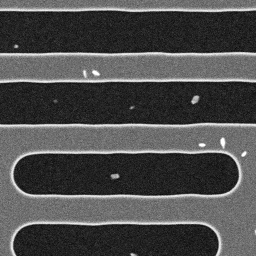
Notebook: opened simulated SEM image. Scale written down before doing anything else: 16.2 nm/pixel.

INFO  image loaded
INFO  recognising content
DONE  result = groups of lines, slits or small figures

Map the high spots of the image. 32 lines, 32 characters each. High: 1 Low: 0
11111111111111111111111111111111
00000000000000000000000000000000
00000000000000000000000000000000
00000000000000000000000000000000
00000000000000000000000000000000
00000000000000000000000000000000
00000000000000000000000000000000
11111111111111111111111111111111
11111111111111111111111111111111
11111111111111111111111111111111
00000000000000000000000000000000
00000000000000000000000000000000
00000000000000000000000000000000
00000000000000000000000000000000
00000000000000000000000000000000
00000000000000000000000001100000
11111111111111111111111111111111
11111111111111111111111111111111
11111111111111111111111111111111
11100000000000000000000000000111
11000000000000000000000000000011
11000000000000000000000000000011
11000000000000000000000000000011
11000000000000000000000000000111
11111111111111111100111111111111
11111111111111111111111111111111
11111111111111111111111111111111
11111111111111111111111111111111
11100000000000000000000000111111
11000000000000000000000000011111
11000000000000000000000000011111
11000000000000000000000000011111